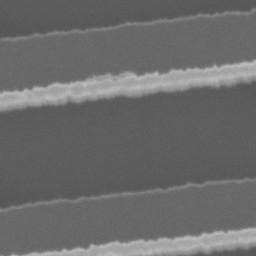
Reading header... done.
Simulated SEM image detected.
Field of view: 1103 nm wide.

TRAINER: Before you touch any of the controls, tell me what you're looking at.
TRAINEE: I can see lines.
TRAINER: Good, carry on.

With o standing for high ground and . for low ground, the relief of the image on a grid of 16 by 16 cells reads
................
........oooooooo
oooooooooooooooo
oooooooooooooooo
oooooooooooooooo
oooooooooo......
o...............
................
................
................
................
.............ooo
.....ooooooooooo
oooooooooooooooo
oooooooooooooooo
ooooooooooooo...